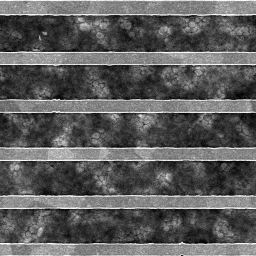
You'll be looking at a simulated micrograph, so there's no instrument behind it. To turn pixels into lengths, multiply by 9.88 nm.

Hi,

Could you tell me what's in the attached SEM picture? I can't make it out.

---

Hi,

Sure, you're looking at parallel lines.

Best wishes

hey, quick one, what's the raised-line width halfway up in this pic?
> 125 nm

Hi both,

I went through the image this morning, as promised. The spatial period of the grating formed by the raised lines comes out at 474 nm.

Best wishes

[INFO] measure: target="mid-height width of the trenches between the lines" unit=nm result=353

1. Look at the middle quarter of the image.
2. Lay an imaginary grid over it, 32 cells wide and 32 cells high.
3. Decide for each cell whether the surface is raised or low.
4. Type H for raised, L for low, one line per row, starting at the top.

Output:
LLLLLLLLLLLLLLLLLLLLLLLLLLLLLLLL
LLLLLLLLLLLLLLLLLLLLLLLLLLLLLLLL
LLLLLLLLLLLLLLLLLLLLLLLLLLLLLLLL
LLLLLLLLLLLLLLLLLLLLLLLLLLLLLLLL
LLLLLLLLLLLLLLLLLLLLLLLLLLLLLLLL
LLLLLLLLLLLLLLLLLLLLLLLLLLLLLLLL
LLLLLLLLLLLLLLLLLLLLLLLLLLLLLLLL
LLLLLLLLLLLLLLLLLLLLLLLLLLLLLLLL
LLLLLLLLLLLLLLLLLLLLLLLLLLLLLLLL
HHHHHHHHHHHHHHHHHHHHHHHHHHHHHHHH
HHHHHHHHHHHHHHHHHHHHHHHHHHHHHHHH
HHHHHHHHHHHHHHHHHHHHHHHHHHHHHHHH
LLLLLLLLLLLLLLLLLLLLLLLLLLLLLLLL
LLLLLLLLLLLLLLLLLLLLLLLLLLLLLLLL
LLLLLLLLLLLLLLLLLLLLLLLLLLLLLLLL
LLLLLLLLLLLLLLLLLLLLLLLLLLLLLLLL
LLLLLLLLLLLLLLLLLLLLLLLLLLLLLLLL
LLLLLLLLLLLLLLLLLLLLLLLLLLLLLLLL
LLLLLLLLLLLLLLLLLLLLLLLLLLLLLLLL
LLLLLLLLLLLLLLLLLLLLLLLLLLLLLLLL
LLLLLLLLLLLLLLLLLLLLLLLLLLLLLLLL
HHHHHHHHHHHHHHHHHHHHHHHHHHHHHHHH
HHHHHHHHHHHHHHHHHHHHHHHHHHHHHHHH
HHHHHHHHHHHHHHHHHHHHHHHHHHHHHHHH
LLLLLLLLLLLLLLLLLLLLLLLLLLLLLLLL
LLLLLLLLLLLLLLLLLLLLLLLLLLLLLLLL
LLLLLLLLLLLLLLLLLLLLLLLLLLLLLLLL
LLLLLLLLLLLLLLLLLLLLLLLLLLLLLLLL
LLLLLLLLLLLLLLLLLLLLLLLLLLHLLLLL
LLLLLLLLLLLLLLLLLLLLLLLLLLLLLLLL
LLLLLLLLLLLLLLLLLLLLLLLLLLLLLLLL
LLLLLLLLLLLLLLLLLLLLLLLLLLLLLLLL